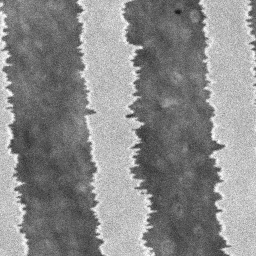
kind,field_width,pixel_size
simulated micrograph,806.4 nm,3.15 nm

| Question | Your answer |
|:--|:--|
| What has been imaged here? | one or a few lines or trenches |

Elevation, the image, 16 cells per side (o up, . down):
.....ooo.....ooo
.....ooo.....ooo
.....ooo.....ooo
.....ooo.....ooo
.....ooo.....ooo
o....ooo.....ooo
o.....oo.....ooo
o.....oo.....ooo
o.....ooo....ooo
o.....oo......oo
o.....oo......oo
o.....ooo.....oo
o.....ooo.....oo
o.....ooo.....oo
o.....ooo.....oo
oo....ooo.....oo